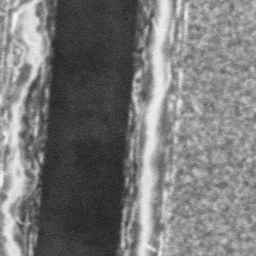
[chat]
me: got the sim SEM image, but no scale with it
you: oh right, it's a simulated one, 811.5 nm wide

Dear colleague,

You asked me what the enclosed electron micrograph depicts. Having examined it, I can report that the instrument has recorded one or a few lines or trenches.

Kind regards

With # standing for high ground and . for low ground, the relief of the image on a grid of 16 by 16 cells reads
##........######
##........######
##........######
##........######
##........######
##........######
#.........######
#........#######
#........#######
#........#######
#........#######
#........#######
#........#######
.........#######
#........#######
#........#######